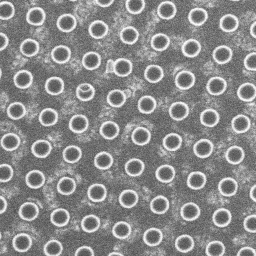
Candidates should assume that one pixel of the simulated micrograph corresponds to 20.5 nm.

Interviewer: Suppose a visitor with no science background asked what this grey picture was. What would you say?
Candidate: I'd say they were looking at a regular array of raised bodies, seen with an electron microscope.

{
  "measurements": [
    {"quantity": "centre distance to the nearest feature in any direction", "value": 644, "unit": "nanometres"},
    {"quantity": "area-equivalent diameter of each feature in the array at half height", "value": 0.353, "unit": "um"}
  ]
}